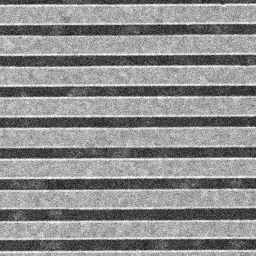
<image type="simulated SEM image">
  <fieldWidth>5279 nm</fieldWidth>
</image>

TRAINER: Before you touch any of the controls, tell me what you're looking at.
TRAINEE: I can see parallel lines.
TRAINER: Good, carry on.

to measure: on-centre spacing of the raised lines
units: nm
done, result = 635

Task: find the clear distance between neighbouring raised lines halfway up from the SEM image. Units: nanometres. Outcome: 255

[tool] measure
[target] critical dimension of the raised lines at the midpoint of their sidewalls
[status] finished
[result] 18.5 px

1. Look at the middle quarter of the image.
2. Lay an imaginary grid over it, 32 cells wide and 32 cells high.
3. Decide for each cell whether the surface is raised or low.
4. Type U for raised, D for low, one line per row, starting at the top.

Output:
DDDDDDDDDDDDDDDDDDDDDDDDDDDDDDDD
UUUUUUUUUUUUUUUUUUUUUUUUUUUUUUUU
UUUUUUUUUUUUUUUUUUUUUUUUUUUUUUUU
UUUUUUUUUUUUUUUUUUUUUUUUUUUUUUUU
UUUUUUUUUUUUUUUUUUUUUUUUUUUUUUUU
DDDDDDDDDDDDDDDDDDDDDDDDDDDDDDDD
DDDDDDDDDDDDDDDDDDDDDDDDDDDDDDDD
DDDDDDDDDDDDDDDDDDDDDDDDDDDDDDDD
DDDDDDDDDDDDDDDDUUUUUUUUUUUUUUUU
UUUUUUUUUUUUUUUUUUUUUUUUUUUUUUUU
UUUUUUUUUUUUUUUUUUUUUUUUUUUUUUUU
UUUUUUUUUUUUUUUUUUUUUUUUUUUUUUUU
UUUUUUUUUUUUUUUUUUUUUUUUUUUUUUUU
DDDDDDDDDDDDDDDDDDDDDDDDDDDDDDDD
DDDDDDDDDDDDDDDDDDDDDDDDDDDDDDDD
DDDDDDDDDDDDDDDDDDDDDDDDDDDDDDDD
UUUUUUUUUUUUUUUUUUUUUUUUUUUUUUUU
UUUUUUUUUUUUUUUUUUUUUUUUUUUUUUUU
UUUUUUUUUUUUUUUUUUUUUUUUUUUUUUUU
UUUUUUUUUUUUUUUUUUUUUUUUUUUUUUUU
UUUUUUUUUUUUUUUUUUUUUUUUUUUUUUUD
DDDDDDDDDDDDDDDDDDDDDDDDDDDDDDDD
DDDDDDDDDDDDDDDDDDDDDDDDDDDDDDDD
DDDDDDDDDDDDDDDDDDDDDDDDDDDDDDDD
UUUUUUUUUUUUUUUUUUUUUUUUUUUUUUUU
UUUUUUUUUUUUUUUUUUUUUUUUUUUUUUUU
UUUUUUUUUUUUUUUUUUUUUUUUUUUUUUUU
UUUUUUUUUUUUUUUUUUUUUUUUUUUUUUUU
DDDDDDDDDDDDDDDDDDDDDDDDDDDDDDDD
DDDDDDDDDDDDDDDDDDDDDDDDDDDDDDDD
DDDDDDDDDDDDDDDDDDDDDDDDDDDDDDDD
DDDDDDDDDDDDDDDDDDDDDDDDDDDDDDDD